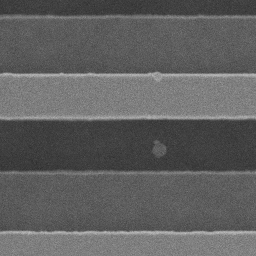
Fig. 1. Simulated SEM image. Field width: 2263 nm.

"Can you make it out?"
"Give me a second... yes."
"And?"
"lines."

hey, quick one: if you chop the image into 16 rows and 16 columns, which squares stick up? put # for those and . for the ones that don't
................
################
################
################
################
################
################
................
................
................
................
################
################
################
################
################